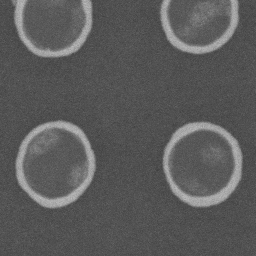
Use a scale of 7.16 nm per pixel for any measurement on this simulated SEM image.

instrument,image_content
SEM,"raised bodies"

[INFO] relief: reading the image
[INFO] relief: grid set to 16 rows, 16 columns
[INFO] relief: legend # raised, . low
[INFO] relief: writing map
.#####....#####.
.#####....#####.
..###......###..
................
................
................
................
................
..###......###..
.#####....#####.
.#####....#####.
..###......####.
..##........#...
................
................
................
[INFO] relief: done